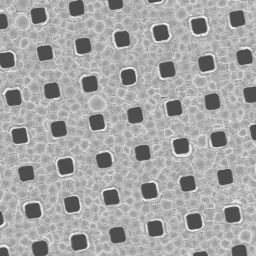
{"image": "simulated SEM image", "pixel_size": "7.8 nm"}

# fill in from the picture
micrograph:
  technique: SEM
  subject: a regular array of holes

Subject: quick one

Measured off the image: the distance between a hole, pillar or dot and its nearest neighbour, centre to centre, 298 nm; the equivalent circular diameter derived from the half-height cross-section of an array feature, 128 nm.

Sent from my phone